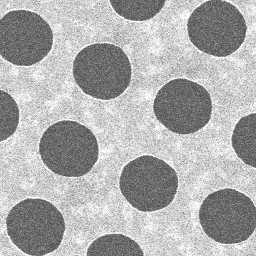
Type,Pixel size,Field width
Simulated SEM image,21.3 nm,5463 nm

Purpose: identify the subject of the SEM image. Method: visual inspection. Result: holes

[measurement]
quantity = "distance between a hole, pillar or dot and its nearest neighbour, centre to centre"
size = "1810 nm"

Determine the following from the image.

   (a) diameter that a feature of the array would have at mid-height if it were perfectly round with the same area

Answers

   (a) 1.23 microns